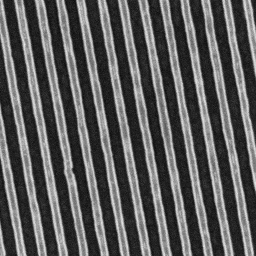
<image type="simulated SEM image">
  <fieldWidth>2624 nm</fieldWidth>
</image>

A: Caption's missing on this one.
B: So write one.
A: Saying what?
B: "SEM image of parallel lines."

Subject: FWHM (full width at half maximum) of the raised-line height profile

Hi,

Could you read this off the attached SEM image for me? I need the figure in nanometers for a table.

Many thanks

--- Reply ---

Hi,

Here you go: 69.4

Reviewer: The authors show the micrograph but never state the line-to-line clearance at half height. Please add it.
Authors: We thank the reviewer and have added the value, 138 nm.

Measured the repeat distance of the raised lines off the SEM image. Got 209 nanometres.